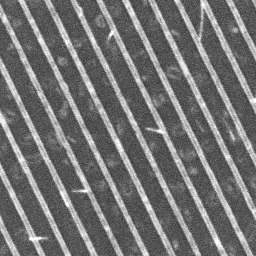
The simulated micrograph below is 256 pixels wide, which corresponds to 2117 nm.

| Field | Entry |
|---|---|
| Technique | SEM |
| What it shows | parallel lines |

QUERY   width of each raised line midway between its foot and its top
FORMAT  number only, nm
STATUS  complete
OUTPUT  35.3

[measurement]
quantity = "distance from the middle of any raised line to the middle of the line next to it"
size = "193 nm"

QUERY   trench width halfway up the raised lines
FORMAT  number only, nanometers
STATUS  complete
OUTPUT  157